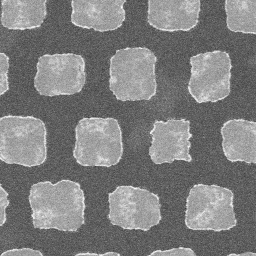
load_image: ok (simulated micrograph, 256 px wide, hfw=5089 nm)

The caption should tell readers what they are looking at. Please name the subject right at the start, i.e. a regular array of raised bodies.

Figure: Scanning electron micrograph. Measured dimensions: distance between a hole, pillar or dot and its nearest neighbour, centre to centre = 1480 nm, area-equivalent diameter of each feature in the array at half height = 0.981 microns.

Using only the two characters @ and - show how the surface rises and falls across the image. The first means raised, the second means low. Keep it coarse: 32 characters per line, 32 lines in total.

@@@@@@---@@@@@@----@@@@@@---@@@@
@@@@@@---@@@@@@----@@@@@@---@@@@
@@@@@----@@@@@@----@@@@@@---@@@@
-@@@-------@@@@-----@@@@-----@@@
--------------------------------
--------------------------------
---------------@@@@-------@@----
@----@@@@@----@@@@@-----@@@@@---
@----@@@@@----@@@@@-----@@@@@---
@---@@@@@@@---@@@@@-----@@@@@---
@---@@@@@@----@@@@@-----@@@@@---
-----@@@@-----@@@@@-----@@@@@---
---------------@@--------@@-----
--------------------------------
--------------------------------
@@@@@-----@@@@@-----@@@@----@@@@
@@@@@@----@@@@@----@@@@@----@@@@
@@@@@@----@@@@@----@@@@@----@@@@
@@@@@@---@@@@@@----@@@@@----@@@@
@@@@@@---@@@@@@----@@@@@----@@@@
--@@@-----@@@@------------------
--------------------------------
--------------------------------
----@@@@@@-----@@-------@@@@----
@---@@@@@@----@@@@@-----@@@@@---
@---@@@@@@----@@@@@@---@@@@@@---
@---@@@@@@----@@@@@@---@@@@@@---
@---@@@@@@----@@@@@@---@@@@@@---
-----@-@@@-----@@@@-----@@@@@---
--------------------------------
--------------------------------
-@@@@---------------@@@@--------